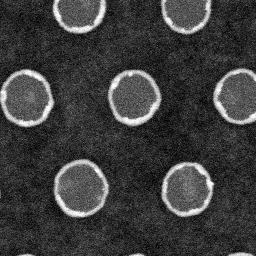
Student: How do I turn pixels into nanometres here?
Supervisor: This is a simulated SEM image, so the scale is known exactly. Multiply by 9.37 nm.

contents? raised bodies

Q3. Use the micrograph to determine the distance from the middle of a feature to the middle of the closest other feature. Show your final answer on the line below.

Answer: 0.99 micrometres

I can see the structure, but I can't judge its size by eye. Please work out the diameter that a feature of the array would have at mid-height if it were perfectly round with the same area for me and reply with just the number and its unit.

0.48 um